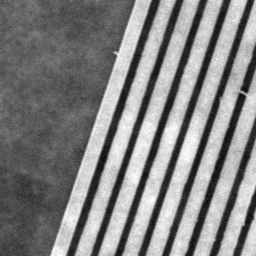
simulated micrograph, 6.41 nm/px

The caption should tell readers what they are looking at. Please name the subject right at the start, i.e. parallel lines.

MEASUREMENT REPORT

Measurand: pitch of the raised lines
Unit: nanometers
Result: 144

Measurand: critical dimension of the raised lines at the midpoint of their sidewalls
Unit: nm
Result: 78.2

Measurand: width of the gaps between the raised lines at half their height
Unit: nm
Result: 66.1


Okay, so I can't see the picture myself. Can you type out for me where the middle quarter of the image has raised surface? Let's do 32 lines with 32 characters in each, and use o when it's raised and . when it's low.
.............ooo...ooo...ooo...o
............oooo...ooo..oooo..oo
............ooo...ooo...oooo..oo
............ooo...ooo...ooo...oo
...........oooo...ooo..oooo..ooo
...........ooo...ooo...oooo..ooo
...........ooo...ooo...ooo...ooo
..........oooo...ooo..oooo..oooo
..........ooo...ooo...ooo...ooo.
..........ooo...ooo...ooo...ooo.
.........oooo...ooo..oooo..oooo.
.........ooo...ooo...ooo...ooo..
.........ooo...ooo...ooo...ooo..
........oooo...ooo..oooo..oooo..
........ooo...ooo...ooo...ooo...
........ooo...ooo...ooo...ooo...
.......oooo...ooo..oooo..oooo..o
.......ooo...ooo...ooo...ooo...o
.......ooo...ooo...ooo...ooo...o
......oooo...ooo..oooo..oooo..oo
......ooo...ooo...ooo...ooo...oo
......ooo...ooo...ooo...ooo...oo
.....oooo...ooo..oooo..oooo..ooo
.....ooo...ooo...ooo...ooo...ooo
.....ooo...ooo...ooo...ooo..oooo
....oooo...ooo..oooo..oooo..oooo
....ooo...ooo...ooo...ooo...ooo.
....ooo...ooo...ooo...ooo..oooo.
...oooo...ooo..oooo..oooo..oooo.
...ooo...ooo...ooo...ooo...ooo..
...ooo...ooo...ooo...ooo...ooo..
..oooo...ooo..oooo..oooo..oooo..